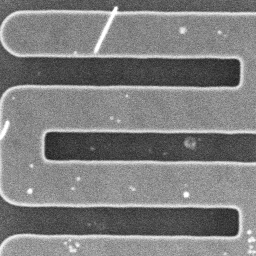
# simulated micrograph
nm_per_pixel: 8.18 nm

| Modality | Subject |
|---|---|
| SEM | groups of lines, slits or small figures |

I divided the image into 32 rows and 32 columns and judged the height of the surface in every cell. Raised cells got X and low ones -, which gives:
--------------------------------
--XXXXXXXXXXX-X-----------------
-XXXXXXXXXXXXXXXXXXXXXXXXXXXXXXX
XXXXXXXXXXXXXXXXXXXXXXXXXXXXXXXX
XXXXXXXXXXXXXXXXXXXXXXXXXXXXXXXX
XXXXXXXXXXXXXXXXXXXXXXXXXXXXXXXX
-XXXXXXXXXXXXXXXXXXXXXXXXXXXXXXX
------------------------------XX
------------------------------XX
------------------------------XX
------------------------------XX
-XXXXXXXXXXXXXXXXXXXXXXXXXXXXXXX
XXXXXXXXXXXXXXXXXXXXXXXXXXXXXXXX
XXXXXXXXXXXXXXXXXXXXXXXXXXXXXXXX
XXXXXXXXXXXXXXXXXXXXXXXXXXXXXXXX
XXXXXXXXXXXXXXXXXXXXXXXXXXXXXXXX
XXXXXX----------XX-XXXXXXXXXXXXX
XXXXX---------------------------
XXXXX---------------------------
XXXXXX--------------------------
XXXXXXXXXXXXXXXXXXXXXXXXXXXXXXXX
XXXXXXXXXXXXXXXXXXXXXXXXXXXXXXXX
XXXXXXXXXXXXXXXXXXXXXXXXXXXXXXXX
XXXXXXXXXXXXXXXXXXXXXXXXXXXXXXXX
XXXXXXXXXXXXXXXXXXXXXXXXXXXXXXXX
--XXXXXXXXXXXXXXXXXXXXXXXXXXXXXX
------------------------------XX
------------------------------XX
------------------------------XX
--XXXXXXXXXXXXX-X------------XXX
XXXXXXXXXXXXXXXXXXXXXXXXXXXXXXXX
XXXXXXXXXXXXXXXXXXXXXXXXXXXXXXXX